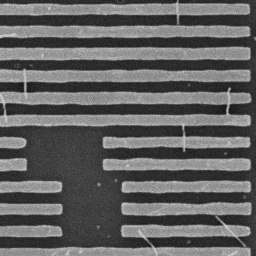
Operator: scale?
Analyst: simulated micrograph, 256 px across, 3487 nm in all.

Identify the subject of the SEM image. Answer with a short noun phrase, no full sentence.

wiring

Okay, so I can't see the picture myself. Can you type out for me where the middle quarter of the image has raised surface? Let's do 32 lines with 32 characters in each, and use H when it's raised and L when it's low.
LLLLLLLLLLLLLLLLLLLLLLLLLLLLLLLL
LLLLLLLLLLLLLLLLLLLLLLLLLLLLLLLL
HHHHHHHHHHHHHHHHHHHHHHHHHHHHHHHH
HHHHHHHHHHHHHHHHHHHHHHHHHHHHHHHH
LLLLLLLLLLLLLLLLLLLLLLLLLLLLLLLL
LLLLLLLLLLLLLLLLLLLLLLLLLLLLLLLL
LLLLLLLLLLLLLLLLLLLLLLLLLLLLLLLL
HHHHHHHHHHHHHHHHHHHHHHLLLHHHHHHH
HHHHHHHHHHHHHHHHHHHHHHHHHHHHHHHH
HHHHHHHHHHHHHHHHHHHHHHHHHHHHHHHH
LLLLLLLLLLLLLLLLLLLLLLLLLLLLLLLL
LLLLLLLLLLLLLLLLLLLLLLLLLLLLLLLL
LLLLLLLLLLLLLLLLLLLLLLLLLLLLLLLL
HHHHHHHHHHHHHHHHHHHHHHHHHHHHHHHH
HHHHHHHHHHHHHHHHHHHHHHHHHHHHHHHH
LLLLLLLLLLLLLLLLLLLLLLLLLLLLLHLL
LLLLLLLLLLLLLLLLLLLLLLLLLLLLLLLL
LLLLLLLLLLLLLLLLLLLLLLLLLLLLLLLL
LLLLLLLLLLHHLLLLLLLLLLLLHHHHHHHH
LLLLLLLLLLHHHHHHHHHHHHHHHHHHHHHH
LLLLLLLLLLHHHHHHHHHHHHHHHHHHHHHH
LLLLLLLLLLLLLLLLLLLLLLLLLLLLLLLL
LLLLLLLLLLLLLLLLLLLLLLLLLLLLLLLL
LLLLLLLLLLLLLLLLLLLLLLLLLLLLLLLL
LLLLLLLLLLHHHHHHHHHHHHHHHHHHHHHH
LLLLLLLLLLHHHHHHHHHHHHHHHHHHHHHH
LLLLLLLLLLLLLLLLLLLLLLLLLLLLLLLL
LLLLLLLLLLLLLLLLLLLLLLLLLLLLLLLL
LLLLLLLLLLLLLLLLLLLLLLLLLLLLLLLL
LLLLLLLLLLLLLLLLLLLLLHHLLLLHHLLL
LLLLLLLLLLLLLLLHHHHHHHHHHHHHHHHH
LLLLLLLLLLLLLLLHHHHHHHHHHHHHHHHH